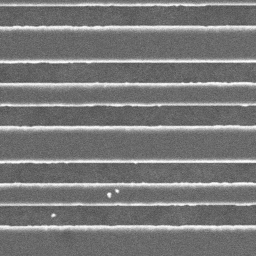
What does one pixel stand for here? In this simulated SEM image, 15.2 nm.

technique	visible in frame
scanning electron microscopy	lines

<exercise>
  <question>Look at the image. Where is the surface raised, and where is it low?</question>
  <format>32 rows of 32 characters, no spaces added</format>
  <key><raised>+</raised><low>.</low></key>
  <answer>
++++++++++++++++++++++++++++++++
................................
................................
++++++++++++++++++++++++++++++++
++++++++++++++++++++++++++++++++
++++++++++++++++++++++++++++++++
++++++++++++++++++++++++++++++++
++++++++++++++++++++++++++++++++
................................
................................
+++++...++++++++++++++++++++++++
++++++++++++++++++++++++++++++++
++++++++++++++++++++++++++++++++
................................
................................
................................
++++++++++++++++++++++++++++++++
++++++++++++++++++++++++++++++++
++++++++++++++++++++++++++++++++
++++++++++++++++++++++++++++++++
................................
................................
................................
++++++++++++++++++++++++++++++++
++++++++++++++++++++++++++++++++
++++++++++++++++++++++++++++++++
................................
................................
++++++++++++++++++++++++++++++++
++++++++++++++++++++++++++++++++
++++++++++++++++++++++++++++++++
++++++++++++++++++++++++++++++++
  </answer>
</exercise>